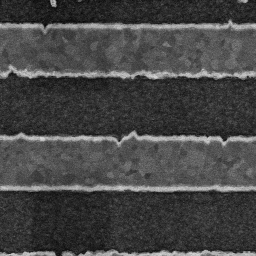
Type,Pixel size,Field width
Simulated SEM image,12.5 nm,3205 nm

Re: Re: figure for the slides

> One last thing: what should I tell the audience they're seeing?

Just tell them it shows one or a few lines or trenches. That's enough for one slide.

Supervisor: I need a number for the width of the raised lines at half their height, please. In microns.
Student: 0.621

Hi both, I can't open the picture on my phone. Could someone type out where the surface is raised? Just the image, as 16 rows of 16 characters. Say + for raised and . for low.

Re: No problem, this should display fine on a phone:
................
................
++++++++++++++++
++++++++++++++++
++++++++++++++++
................
................
................
................
++++++++++++++++
++++++++++++++++
++++++++++++++++
................
................
................
................